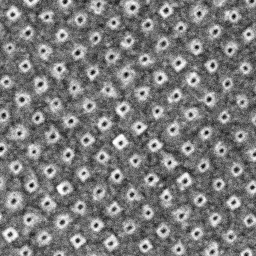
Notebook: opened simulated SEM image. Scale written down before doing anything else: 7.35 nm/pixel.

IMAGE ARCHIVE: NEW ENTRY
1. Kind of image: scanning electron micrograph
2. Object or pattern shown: holes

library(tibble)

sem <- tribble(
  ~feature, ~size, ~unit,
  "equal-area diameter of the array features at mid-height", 24.9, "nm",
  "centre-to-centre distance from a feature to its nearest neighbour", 135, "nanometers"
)